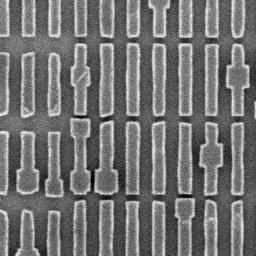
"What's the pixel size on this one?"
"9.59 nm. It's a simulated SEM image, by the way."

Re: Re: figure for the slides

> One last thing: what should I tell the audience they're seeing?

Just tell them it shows wiring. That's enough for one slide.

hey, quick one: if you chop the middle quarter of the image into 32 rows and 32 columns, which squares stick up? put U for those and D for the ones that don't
DDUUUUDDDUUUDDDDUUUDDDUUUDDDDUUU
DDUUUUDDDUUUDDDDUUUDDDUUUDDDDUUU
DDUUUUDDDUUUDDDDUUUDDDUUUDDDDUUU
DDUUUUDDDUUUDDDDUUUDDDUUUDDDDUUU
DDUUUUDDDUUUDDDDUUUDDDUUUDDDDUUU
DDUUUUDDDUUUDDDDUUUDDDDUUDDDDUUU
DDDUUUDDDUUUDDDDUUUDDDDUUDDDDUUU
DDDUUUDDDUUUDDDDUUUDDDUUUDDDDUUU
DDDUUUDDDUUUDDDDUUUDDDUUUDDDDUUU
DDDUUDDDDUUUDDDDUUUDDDUUUDDDDUUU
DDDUUDDDDUUUDDDDUUUDDDUUUDDDDUUU
DDDUUDDDDUUUDDDDUUUDDDUUUDDDDUUU
DDDUUDDDDUUUDDDDUUUDDDDUUDDDDUUU
DDDDDDDDDDDDDDDDDDDDDDDDDDDDDDDD
DDUUUUDDDDDUDDDDDDDDDDDDDDDDDDDD
DDUUUUDDDUUUDDDDUUUDDDUUUDDDDUUU
DDUUUUDDDUUUDDDDUUUDDDUUUDDDDUUU
DDUUUUDDDUUUDDDDUUUDDDUUUDDDDUUU
DDUUUUDDDUUUDDDDUUUDDDUUUDDDDUUU
DDDUUDDDDUUUDDDDUUUDDDUUUDDDDUUU
DDDUUDDDDUUUDDDDUUUDDDUUUDDDDUUU
DDDUUDDDDUUUDDDDUUUDDDUUUDDDDUUU
DDDUUDDDDUUUDDDDUUUDDDUUUDDDDUUU
DDDUUDDDDUUUDDDDUUUDDDUUUDDDDUUU
DDDUUDDDDUUUDDDDUUUDDDUUUDDDDUUU
DDDUUDDDDUUUDDDDUUUDDDUUUDDDDUUU
DDUUUUDDUUUUUDDDUUUDDDUUUDDDDUUU
DDUUUUDDUUUUUDDDUUUDDDUUUDDDDUUU
DDUUUUDDUUUUUDDDUUUDDDUUUDDDDUUU
DDUUUUDDUUUUUDDDUUUDDDUUUDDDDUUU
DDUUUUDDUUUUUDDDUUUDDDUUUDDDDUUU
DDUUUUDDUUUUUDDDUUUDDDUUUDDDDUUU